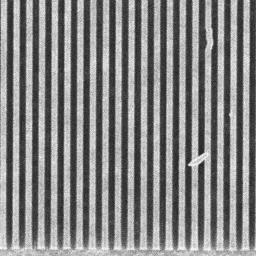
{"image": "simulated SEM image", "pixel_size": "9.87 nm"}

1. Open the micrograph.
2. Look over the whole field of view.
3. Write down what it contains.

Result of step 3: parallel lines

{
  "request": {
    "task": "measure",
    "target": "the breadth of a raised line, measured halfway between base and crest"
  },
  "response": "0.0666 um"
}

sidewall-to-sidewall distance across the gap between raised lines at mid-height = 5.88 px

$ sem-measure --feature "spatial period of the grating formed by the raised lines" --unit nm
126